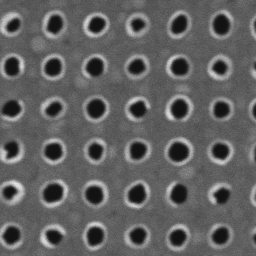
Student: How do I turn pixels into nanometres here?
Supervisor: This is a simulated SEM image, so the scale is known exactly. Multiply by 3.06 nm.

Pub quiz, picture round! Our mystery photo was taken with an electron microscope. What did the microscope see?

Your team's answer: a regular array of holes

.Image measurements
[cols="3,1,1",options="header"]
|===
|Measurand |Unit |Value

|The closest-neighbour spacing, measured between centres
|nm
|127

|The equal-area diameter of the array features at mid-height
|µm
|0.0504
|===